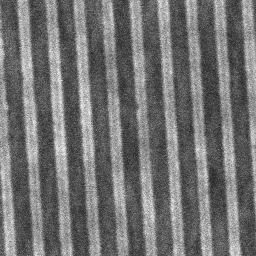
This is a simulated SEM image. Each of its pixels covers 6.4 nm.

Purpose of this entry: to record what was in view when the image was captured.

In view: parallel lines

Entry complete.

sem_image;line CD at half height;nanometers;59.1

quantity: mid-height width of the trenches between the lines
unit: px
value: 19.3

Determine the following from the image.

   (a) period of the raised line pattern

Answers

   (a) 28 pixels